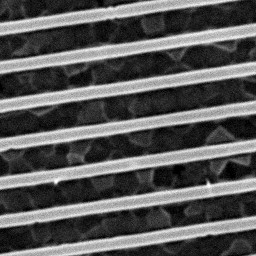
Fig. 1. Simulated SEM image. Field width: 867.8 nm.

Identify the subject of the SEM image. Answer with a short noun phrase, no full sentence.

parallel lines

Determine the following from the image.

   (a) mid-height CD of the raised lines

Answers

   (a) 38.6 nm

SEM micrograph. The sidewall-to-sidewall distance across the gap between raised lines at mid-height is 0.0907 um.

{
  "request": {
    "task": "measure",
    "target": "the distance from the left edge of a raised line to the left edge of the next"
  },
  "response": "38.1 px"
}